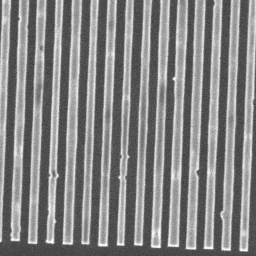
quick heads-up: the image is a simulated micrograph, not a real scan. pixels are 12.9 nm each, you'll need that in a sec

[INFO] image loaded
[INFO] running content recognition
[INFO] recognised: parallel lines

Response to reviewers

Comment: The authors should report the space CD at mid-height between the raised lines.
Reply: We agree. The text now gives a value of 123 nm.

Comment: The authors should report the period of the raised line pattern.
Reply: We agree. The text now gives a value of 227 nm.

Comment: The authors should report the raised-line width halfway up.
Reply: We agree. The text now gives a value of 111 nm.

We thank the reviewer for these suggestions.